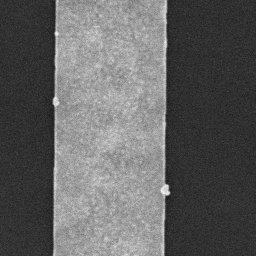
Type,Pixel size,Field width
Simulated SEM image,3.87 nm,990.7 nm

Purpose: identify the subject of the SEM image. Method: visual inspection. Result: wiring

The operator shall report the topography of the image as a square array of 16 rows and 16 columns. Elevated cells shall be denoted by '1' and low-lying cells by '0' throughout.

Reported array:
0000111111000000
0000111111000000
0001111111000000
0001111111000000
0001111111000000
0001111111000000
0001111111000000
0001111111000000
0001111111000000
0001111111000000
0001111111000000
0001111111000000
0001111111000000
0001111111000000
0001111111000000
0001111111000000